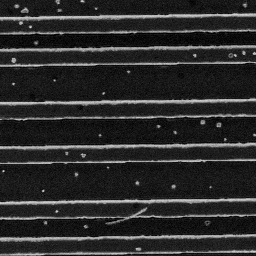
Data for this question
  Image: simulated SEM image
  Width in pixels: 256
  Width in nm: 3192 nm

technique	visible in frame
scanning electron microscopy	lines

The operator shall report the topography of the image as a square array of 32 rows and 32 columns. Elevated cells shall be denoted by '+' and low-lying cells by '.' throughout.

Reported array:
................................
................................
++++++++++++++++++++++++++++++++
++++++++++++++++++++++++++++++++
................................
................................
++++++++++++++++++++++++++++++++
++++++++++++++++++++++++++++++++
................................
................................
................................
................................
.............................+++
++++++++++++++++++++++++++++++++
+++++++++++++++++++++++++++.....
................................
................................
................................
.++.++++++++++++++++++++++++++++
++++++++++++++++++++++++++++++++
................................
................................
................................
................................
................................
++++++++++++++++++++++++++++++++
++++++++++++++++++++++++++++++++
................................
................................
.........................+++++++
++++++++++++++++++++++++++++++++
+++++++++++++++++++++++.........